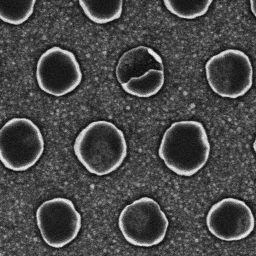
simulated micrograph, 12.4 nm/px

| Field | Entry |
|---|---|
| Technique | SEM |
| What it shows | raised bodies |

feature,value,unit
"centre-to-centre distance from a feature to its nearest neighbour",1060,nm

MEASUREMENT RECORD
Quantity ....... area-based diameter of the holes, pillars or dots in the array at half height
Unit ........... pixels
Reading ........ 45.5